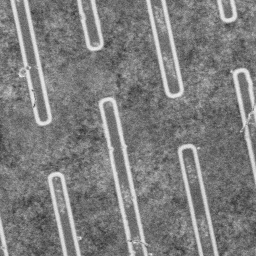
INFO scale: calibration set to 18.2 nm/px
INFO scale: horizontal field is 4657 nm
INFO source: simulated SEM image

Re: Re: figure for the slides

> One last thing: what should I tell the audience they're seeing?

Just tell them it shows one or a few lines or trenches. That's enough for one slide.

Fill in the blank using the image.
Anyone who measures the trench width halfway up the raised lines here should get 986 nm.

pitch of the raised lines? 1220 nm